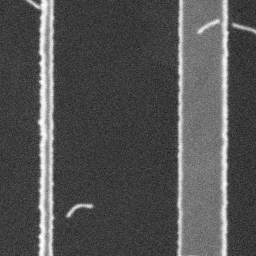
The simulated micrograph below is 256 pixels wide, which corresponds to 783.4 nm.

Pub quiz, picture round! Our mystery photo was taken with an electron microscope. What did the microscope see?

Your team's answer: lines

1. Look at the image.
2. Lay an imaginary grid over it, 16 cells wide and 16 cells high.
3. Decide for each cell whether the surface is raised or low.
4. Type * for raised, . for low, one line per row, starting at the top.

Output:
...........***..
...........***..
...........***..
...........***..
...........***..
...........***..
...........***..
...........***..
...........***..
...........***..
...........***..
...........***..
...........***..
...........***..
...........***..
...........***..